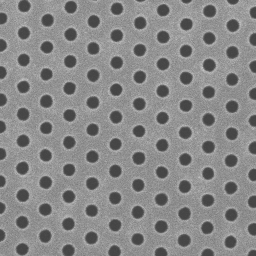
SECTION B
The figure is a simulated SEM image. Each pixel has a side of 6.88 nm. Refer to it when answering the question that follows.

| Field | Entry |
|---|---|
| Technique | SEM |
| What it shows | a regular array of holes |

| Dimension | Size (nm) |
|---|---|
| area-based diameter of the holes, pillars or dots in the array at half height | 80.6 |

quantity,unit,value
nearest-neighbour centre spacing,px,26.5